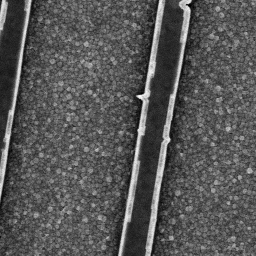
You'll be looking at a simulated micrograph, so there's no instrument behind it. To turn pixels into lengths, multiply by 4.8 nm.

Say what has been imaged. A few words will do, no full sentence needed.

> one or a few lines or trenches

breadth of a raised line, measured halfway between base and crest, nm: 142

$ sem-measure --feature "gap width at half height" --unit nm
615